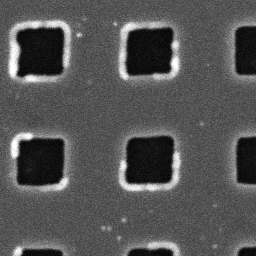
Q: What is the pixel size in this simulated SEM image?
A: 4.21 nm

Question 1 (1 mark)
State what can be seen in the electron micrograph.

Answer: holes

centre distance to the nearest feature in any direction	457	nanometres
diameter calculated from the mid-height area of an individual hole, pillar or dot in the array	0.221	µm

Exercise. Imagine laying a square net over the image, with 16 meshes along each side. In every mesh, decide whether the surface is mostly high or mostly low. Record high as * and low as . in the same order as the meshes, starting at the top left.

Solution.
****************
****************
*...****...****.
*...****...****.
*...****..*****.
****************
****************
****************
****************
*...****...****.
*...****...****.
*..*****.******.
****************
****************
****************
***************.